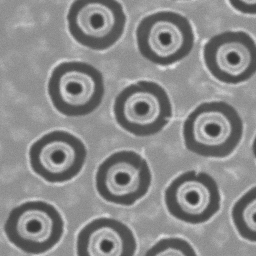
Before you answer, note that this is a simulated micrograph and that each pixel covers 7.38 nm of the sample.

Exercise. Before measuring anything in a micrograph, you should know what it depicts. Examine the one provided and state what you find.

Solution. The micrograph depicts a regular array of ring-shaped grooves with a dot in the middle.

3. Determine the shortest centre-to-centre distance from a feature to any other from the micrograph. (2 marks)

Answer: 0.519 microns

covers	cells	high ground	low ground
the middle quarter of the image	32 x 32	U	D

DDDDDDDUUUUUUUUUUUUUUUUUUUUUUUUU
DDDDDDDDDUUUUUUUUUUUUUUUUUUUUUUU
UUUUUDDDDUUUUUUUUUUUUUUUUUUUUUUU
UUUUUUUDDDUUUUUUUUUUUUUUUUUUUUUU
UDDUUUUDDDUUUUUUUUUDDDDUUUUUUUUU
DDDDDUUDDDUUUUUUDDDDDDDDUUUUUUUU
UDDDDUUDDDUUUUUDDDDDDDDDDUUUUUUU
UUDDUUUDDDUUUUDDDDUUUDDDDDUUUUUU
UUUUUUDDDDUUUDDDUUUUUUUDDDUUUUUU
DUUUUUDDDUUUUDDDUUUDUUUDDDDUUUUU
DDDDDDDDDUUUDDDUUUDDDUUUDDDUUUUU
DDDDDDDDUUUUDDDUUUDDDUUUDDDUUUUU
DDDDDDUUUUUUUDDUUUDDDUUUDDDUUUUD
UUUUUUUUUUUUUDDDUUUUUUUDDDDUUUUD
UUUUUUUUUUUUUDDDDUUUUUDDDDUUUUDD
UUUUUUUUUUUUUUDDDDDDDDDDDUUUUUDD
UUUUUUUUUUUUUUUDDDDDDDDDUUUUUUDD
DDUUUUUUUUUUUUUUUDDDDDDUUUUUUUDD
DDDDUUUUUUUUUUUUUUUUUUUUUUUUUUDD
DDDDDUUUUUUUUUUUUUUUUUUUUUUUUUDD
UDDDDUUUUUUUUUUUUUUUUUUUUUUUUUDD
UUDDDDUUUUUUUUUUUUUUUUUUUUUUUUUD
UUUDDDUUUUUUDDDDDDDUUUUUUUUUUUUU
UUDDDUUUUUUDDDDDDDDDUUUUUUUUUUUU
UUDDDUUUUUDDDDDDDDDDDUUUUUUUUUUU
UDDDDUUUUDDDUUUUUDDDDUUUUUUUUUUU
DDDDUUUUDDDUUUUUUUUDDDUUUUUUUUUU
DDDDUUUUDDDUUDDDUUDDDDUUUUUUUDDD
DDUUUUUUDDDUUDDDDUUDDDUUUUUUDDDD
UUUUUUUUDDDUUDDDUUUDDDUUUUUDDDDD
UUUUUUUUDDDUUUUUUUUDDUUUUUDDDUUU
UUUUUUUUDDDUUUUUUUDDDUUUUDDDUUUU